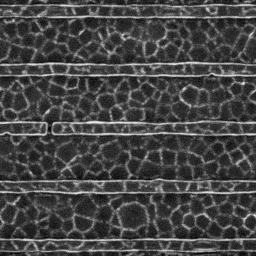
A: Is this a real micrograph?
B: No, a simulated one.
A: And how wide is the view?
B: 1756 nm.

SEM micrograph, parallel lines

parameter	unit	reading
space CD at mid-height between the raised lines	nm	320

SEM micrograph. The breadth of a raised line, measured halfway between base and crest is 0.0824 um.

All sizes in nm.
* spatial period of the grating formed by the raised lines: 402